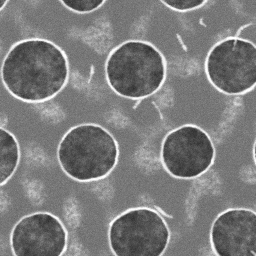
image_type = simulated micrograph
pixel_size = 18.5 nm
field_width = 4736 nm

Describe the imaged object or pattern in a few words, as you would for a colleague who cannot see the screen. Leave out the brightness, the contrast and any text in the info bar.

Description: holes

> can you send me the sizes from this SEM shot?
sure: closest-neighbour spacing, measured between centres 96.7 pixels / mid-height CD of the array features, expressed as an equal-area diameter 56.5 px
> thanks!